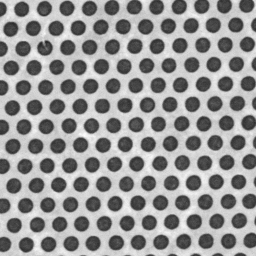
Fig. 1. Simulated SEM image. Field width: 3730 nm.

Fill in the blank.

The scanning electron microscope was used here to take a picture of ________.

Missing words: a regular array of holes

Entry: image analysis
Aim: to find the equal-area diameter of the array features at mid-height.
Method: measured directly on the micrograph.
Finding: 226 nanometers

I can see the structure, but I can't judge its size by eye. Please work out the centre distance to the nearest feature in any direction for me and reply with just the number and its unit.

323 nanometres